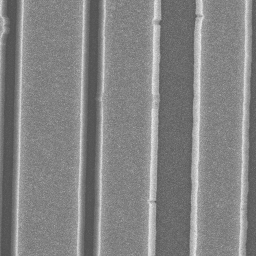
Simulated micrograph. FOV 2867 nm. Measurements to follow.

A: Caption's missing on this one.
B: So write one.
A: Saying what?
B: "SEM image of one or a few lines or trenches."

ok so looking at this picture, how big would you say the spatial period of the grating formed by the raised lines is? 955 nm